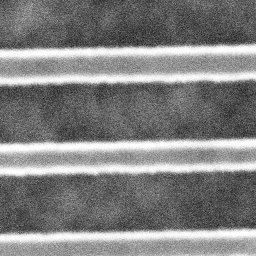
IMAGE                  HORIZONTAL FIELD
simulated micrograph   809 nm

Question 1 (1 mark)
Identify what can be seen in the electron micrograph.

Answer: lines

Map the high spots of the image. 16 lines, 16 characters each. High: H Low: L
LLLLLLLLLLLLLLLL
LLLLLLLLLLLLLLLL
LLLLLLLLLLLLLLLL
HHHHHHHHHHHHHHHH
HHHHHHHHHHHHHHHH
LLLLLLLLLLLLLLLL
LLLLLLLLLLLLLLLL
LLLLLLLLLLLLLLLL
LLLLLLLLLLLLLLLL
HHHHHHHHHHHHHHHH
HHHHHHHHHHHHHHHH
LLLLLLLLLLLLLLLL
LLLLLLLLLLLLLLLL
LLLLLLLLLLLLLLLL
LLLLLLLLLLLLLLHH
HHHHHHHHHHHHHHHH